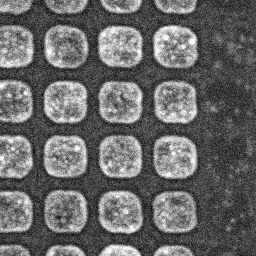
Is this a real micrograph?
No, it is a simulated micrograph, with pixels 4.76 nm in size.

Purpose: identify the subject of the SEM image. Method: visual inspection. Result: a regular array of raised bodies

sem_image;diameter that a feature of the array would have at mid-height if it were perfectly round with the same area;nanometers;210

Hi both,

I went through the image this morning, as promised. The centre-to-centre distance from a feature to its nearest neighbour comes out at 259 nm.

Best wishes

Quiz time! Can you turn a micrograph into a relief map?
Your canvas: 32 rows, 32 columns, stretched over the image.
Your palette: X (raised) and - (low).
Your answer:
XXXX--XXXXX--XXXX---XXXX--------
-------X------------------------
--------------------------------
-------X------X------X----------
XXXX--XXXX---XXXX--XXXXX--------
XXXX--XXXXX-XXXXXX-XXXXX--------
XXXX--XXXXX--XXXXX-XXXXX--------
XXXX--XXXX---XXXX---XXXX--------
--------------------------------
--------------------------------
XXX----XXX---XXX----XXX---------
XXXX--XXXXX--XXXX---XXXX--------
XXXX--XXXXX--XXXXX--XXXX--------
XXXX--XXXXX--XXXX---XXXX--------
XXXX--XXXX---XXXX---XXXX--------
--------------------------------
--------------------------------
XXX---XXXX---XXXX---XXX---------
XXXX--XXXXX--XXXX--XXXXX--------
XXXX--XXXXX--XXXXX-XXXXX--------
XXXX--XXXXX--XXXXX-XXXXX--------
XXX---XXXX---XXXX---XXXX--------
--------------------------------
--------------------------------
XXX---XXXX---XXXX---XXXX--------
XXXX--XXXXX--XXXX--XXXXX--------
XXXX--XXXXX--XXXXX-XXXXX--------
XXXX--XXXXX--XXXXX-XXXXX--------
XXX---XXXX---XXXX---XXXX--------
--------------------------------
--------------------------------
XXX---XXXX---XXXX---XXXX--------